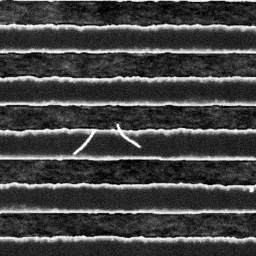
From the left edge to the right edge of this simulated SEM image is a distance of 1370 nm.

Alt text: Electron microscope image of lines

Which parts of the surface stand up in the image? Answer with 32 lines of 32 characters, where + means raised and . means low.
................................
................................
................................
++++++++++++++++++++++++++++++++
++++++++++++++++++++++++++++++++
++++++++++++++++++++++++++++++++
..++...+...++...+..+.+++.+++++++
................................
................................
................................
++++++++++++++++++++++++++++++++
++++++++++++++++++++++++++++++++
++++++++++++++++++++++++++++++++
................................
................................
................................
++++++++++++++++++++++++++++++++
++++++++++++++++++++++++++++++++
++++++++++++++++++++++++++++++++
++++++++++++++++++++++++++++++++
................................
................................
................................
++++++++++++++++++++++++++++++++
++++++++++++++++++++++++++++++++
++++++++++++++++++++++++++++++++
+....+++++++++++++++++++++++++++
................................
................................
................................
++++++++++++++++++++++++++++++++
++++++++++++++++++++++++++++++++